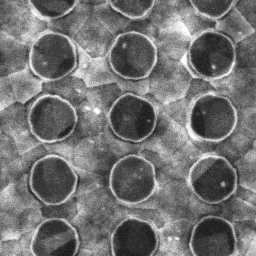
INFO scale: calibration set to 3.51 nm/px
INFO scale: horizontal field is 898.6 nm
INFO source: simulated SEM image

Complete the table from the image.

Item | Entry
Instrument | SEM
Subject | a regular array of raised bodies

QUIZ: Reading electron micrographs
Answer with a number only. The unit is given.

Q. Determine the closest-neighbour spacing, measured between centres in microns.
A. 0.216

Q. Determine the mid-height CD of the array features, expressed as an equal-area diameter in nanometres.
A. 166